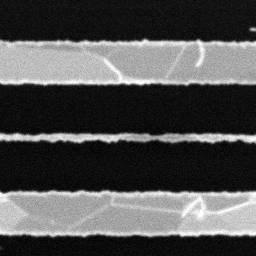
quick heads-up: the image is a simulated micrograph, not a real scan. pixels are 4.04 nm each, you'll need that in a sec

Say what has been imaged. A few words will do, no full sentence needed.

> lines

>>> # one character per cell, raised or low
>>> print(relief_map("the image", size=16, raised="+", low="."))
................
................
................
++++++++++++++++
++++++++++++++++
................
................
................
................
................
................
................
++++++++++++++++
++++++++++++++++
++++++++++++++++
................